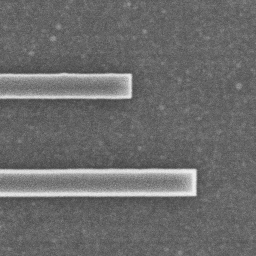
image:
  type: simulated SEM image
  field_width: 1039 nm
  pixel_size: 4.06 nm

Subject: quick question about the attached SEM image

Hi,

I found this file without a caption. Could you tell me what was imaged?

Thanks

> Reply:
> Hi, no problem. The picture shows one or a few lines or trenches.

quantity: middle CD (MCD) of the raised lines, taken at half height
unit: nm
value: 96.9